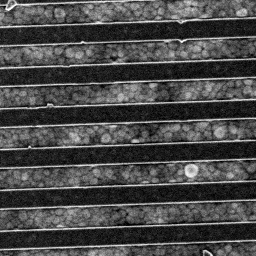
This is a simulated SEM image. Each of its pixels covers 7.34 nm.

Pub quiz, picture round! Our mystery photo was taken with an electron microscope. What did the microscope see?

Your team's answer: parallel lines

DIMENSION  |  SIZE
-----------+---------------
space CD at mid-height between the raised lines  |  158 nm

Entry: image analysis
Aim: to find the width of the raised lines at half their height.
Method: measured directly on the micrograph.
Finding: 0.14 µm